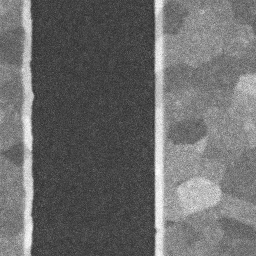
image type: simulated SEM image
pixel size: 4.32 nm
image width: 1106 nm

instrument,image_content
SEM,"one or a few lines or trenches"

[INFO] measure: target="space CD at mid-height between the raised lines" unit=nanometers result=561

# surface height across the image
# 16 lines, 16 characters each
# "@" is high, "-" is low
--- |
@@--------@@@@@@
@@--------@@@@@@
@@--------@@@@@@
@@--------@@@@@@
@@--------@@@@@@
@@--------@@@@@@
@@--------@@@@@@
@@--------@@@@@@
@@--------@@@@@@
@@--------@@@@@@
@@--------@@@@@@
@@--------@@@@@@
@@--------@@@@@@
@@--------@@@@@@
@@--------@@@@@@
@@--------@@@@@@